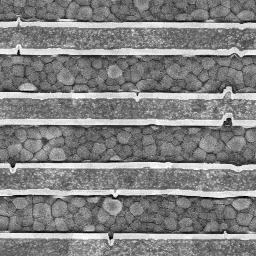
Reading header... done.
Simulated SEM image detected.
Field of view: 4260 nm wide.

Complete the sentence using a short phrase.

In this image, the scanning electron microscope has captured one or a few lines or trenches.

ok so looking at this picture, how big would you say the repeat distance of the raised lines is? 1170 nm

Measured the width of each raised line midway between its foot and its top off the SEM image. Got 466 nm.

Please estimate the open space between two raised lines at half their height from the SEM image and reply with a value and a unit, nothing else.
0.701 µm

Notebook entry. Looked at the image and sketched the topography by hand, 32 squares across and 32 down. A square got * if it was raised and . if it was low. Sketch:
................................
................................
................................
********************************
********************************
********************************
......****************.******.**
................................
................................
................................
................................
............................*...
********************************
********************************
********************************
................................
................................
................................
................................
................................
..................*.**..........
********************************
********************************
********************************
................................
................................
................................
................................
................................
******..*****.******.***....*...
********************************
********************************